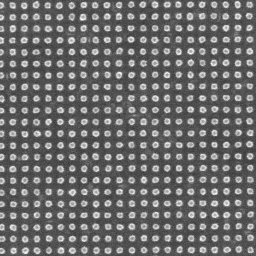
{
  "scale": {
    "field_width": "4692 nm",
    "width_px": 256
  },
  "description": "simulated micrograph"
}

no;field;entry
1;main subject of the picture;a regular array of raised bodies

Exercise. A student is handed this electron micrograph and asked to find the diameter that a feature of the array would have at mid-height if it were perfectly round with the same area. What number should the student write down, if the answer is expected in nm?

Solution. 101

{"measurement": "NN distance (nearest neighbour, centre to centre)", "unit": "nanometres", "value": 206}